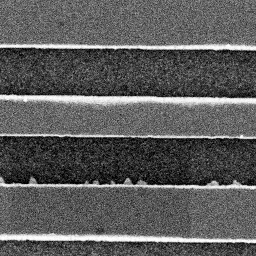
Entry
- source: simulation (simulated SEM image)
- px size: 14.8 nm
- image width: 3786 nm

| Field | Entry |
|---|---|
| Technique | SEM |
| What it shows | lines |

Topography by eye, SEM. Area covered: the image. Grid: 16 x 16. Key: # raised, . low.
################
################
################
................
................
................
################
################
....############
................
................
................
################
################
################
................